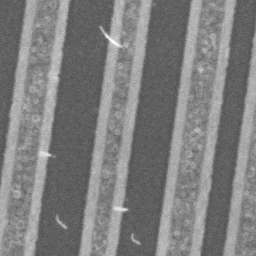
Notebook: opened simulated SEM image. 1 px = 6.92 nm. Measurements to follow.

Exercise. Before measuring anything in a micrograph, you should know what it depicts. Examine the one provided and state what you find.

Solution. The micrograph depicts one or a few lines or trenches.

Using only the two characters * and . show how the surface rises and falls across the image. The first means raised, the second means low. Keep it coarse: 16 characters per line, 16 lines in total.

..**...**...**..
..**...**...**..
..**...**...**..
.***...**...**..
.**....**...**..
.**....*...***..
.**....*...***..
.**...**...**..*
.**...**...**..*
.**...**...**..*
.**...**...**..*
**....**...**..*
**....*....**..*
**....*...***..*
**...**...**..**
**...**...**..**